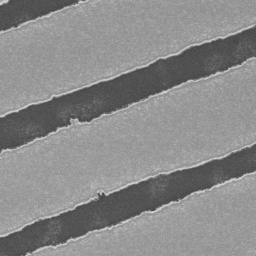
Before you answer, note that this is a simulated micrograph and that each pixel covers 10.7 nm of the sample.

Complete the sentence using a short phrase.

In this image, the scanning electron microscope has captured one or a few lines or trenches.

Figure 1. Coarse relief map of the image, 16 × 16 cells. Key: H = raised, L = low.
LLLLHHHHHHHHHHHH
LLHHHHHHHHHHHHHH
HHHHHHHHHHHHHLLL
HHHHHHHHHHHLLLLL
HHHHHHHHLLLLLLHH
HHHHHLLLLLLHHHHH
HHLLLLLLHHHHHHHH
LLLLLLHHHHHHHHHH
LLLHHHHHHHHHHHHH
HHHHHHHHHHHHHHHL
HHHHHHHHHHHHLLLL
HHHHHHHHLLLLLLHH
HHHHHHLLLLLHHHHH
HHHLLLLLLHHHHHHH
HLLLLLHHHHHHHHHH
LLLHHHHHHHHHHHHH